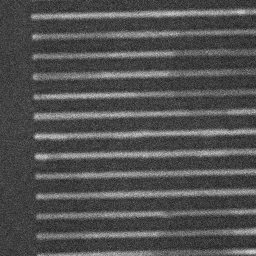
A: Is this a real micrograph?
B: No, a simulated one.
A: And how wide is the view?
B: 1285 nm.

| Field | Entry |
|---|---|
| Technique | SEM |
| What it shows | parallel lines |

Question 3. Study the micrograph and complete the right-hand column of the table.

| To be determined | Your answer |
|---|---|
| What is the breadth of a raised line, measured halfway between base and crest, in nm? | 18.8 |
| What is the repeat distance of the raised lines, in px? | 20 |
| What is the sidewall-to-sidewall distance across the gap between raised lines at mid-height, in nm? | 82.2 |